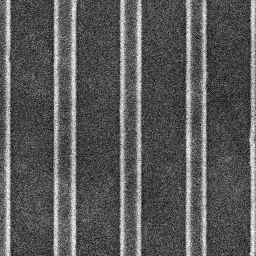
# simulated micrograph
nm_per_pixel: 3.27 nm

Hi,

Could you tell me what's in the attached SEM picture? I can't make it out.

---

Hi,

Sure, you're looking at one or a few lines or trenches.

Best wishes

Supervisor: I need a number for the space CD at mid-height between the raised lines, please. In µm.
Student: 0.155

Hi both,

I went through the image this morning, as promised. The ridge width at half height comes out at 0.0568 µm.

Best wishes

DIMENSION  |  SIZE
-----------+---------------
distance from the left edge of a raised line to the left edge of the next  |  65.7 pixels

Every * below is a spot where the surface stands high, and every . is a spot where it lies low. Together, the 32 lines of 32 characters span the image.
*......**......**......***......
*......**......**.......**......
*......**......**.......**......
*......**......**.......**......
*......**......**.......**......
*......**......**.......**......
*......**......**.......**......
*......**......**.......**......
*......**......**.......**......
*......**......**.......**......
*......**......**.......**......
*......**......**.......**......
*......**......**.......**......
*......**......**.......**......
*......**......**.......**......
*......**......**.......**......
*......**......**.......**......
*......**......**.......**.....*
*......**......**.......**......
*......**......**.......**......
*......**......**.......**......
*......**......**.......**......
*......**......**.......**......
*......**......**.......**......
*......**......**.......**......
*......**......**.......**......
*......**......**.......**......
*......**......**.......**......
*......**......**.......**......
*......**......**.......**......
*......**......**.......**......
*......**......**.......**......